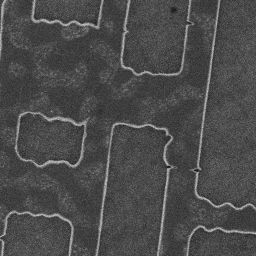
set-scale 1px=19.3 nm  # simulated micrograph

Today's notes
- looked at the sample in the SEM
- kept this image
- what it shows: one or a few lines or trenches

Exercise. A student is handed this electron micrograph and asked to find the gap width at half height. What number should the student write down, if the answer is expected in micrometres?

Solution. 1.17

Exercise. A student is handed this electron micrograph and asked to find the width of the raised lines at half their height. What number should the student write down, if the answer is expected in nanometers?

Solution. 563